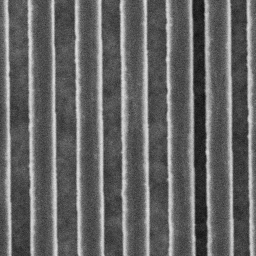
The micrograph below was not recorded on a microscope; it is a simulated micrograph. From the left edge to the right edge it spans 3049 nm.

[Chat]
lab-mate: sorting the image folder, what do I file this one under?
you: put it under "lines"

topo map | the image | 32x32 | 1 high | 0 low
10001110011110011100011100111001
10001110011110011100011100111001
10001110011110011100011100111001
10001110011110011100011100111001
10001110011110011100011100111001
10001110011110011100011100111001
10001110011110011100011100111001
10001110011110011100011100111001
10001110001110011100011100111001
10001110001110011100011100111001
10001110001110011100011100111001
10001110001110011100011100111001
10001110001110011100011100111001
10001110001110011100011100111001
10001110001110011100011100111001
10001110001110011100011100111001
10001110001110011100011100111001
10001110001110011100011100111001
10001110001110011100011100111001
10001110001110011100011100111001
10001110001110011100011100111001
10001110001110011100011100111001
10001110001110011100011100111001
10001110001110011100011100111001
10001110001110011110011100111001
10001110001110011110011100111001
10001110001110011110011100111001
10001110001110011110011100111001
10001110001110011110011100111001
10001110001110011110011100111001
10001110001110011110011100111001
10001110001110011110011100111001